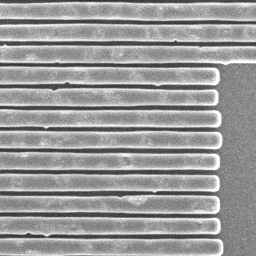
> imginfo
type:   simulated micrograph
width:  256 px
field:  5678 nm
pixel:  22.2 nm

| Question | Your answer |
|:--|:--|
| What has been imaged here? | parallel lines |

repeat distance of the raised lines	21.4	pixels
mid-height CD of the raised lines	360	nm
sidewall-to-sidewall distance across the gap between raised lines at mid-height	119	nanometres